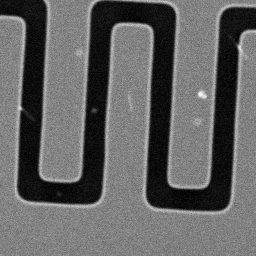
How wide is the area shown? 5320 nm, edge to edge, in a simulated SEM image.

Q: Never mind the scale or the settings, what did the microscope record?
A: groups of lines, slits or small figures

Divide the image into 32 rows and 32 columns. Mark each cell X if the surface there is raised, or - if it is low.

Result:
------XXXXXX---------XXXXXXXXXXX
------XXXXX-----------XXXXXX----
XXX---XXXXX-----------XXXXX-----
XXX---XXXXX---XXXXX---XXXXX-----
XXX---XXXXX---XXXXX---XXXXX---XX
XXX---XXXXX---XXXXX---XXXXX---XX
XXX---XXXXX---XXXXX---XXXXX---XX
XXX---XXXXX---XXXXX---XXXXX---XX
XXX---XXXXX---XXXXX---XXXXX---XX
XXX---XXXXX---XXXXX---XXXXX---XX
XXX---XXXXX---XXXXX---XXXXX---XX
XXX---XXXXX---XXXXX---XXXXX---XX
XXX--XXXXXX--XXXXXX---XXXXX---XX
XXX--XXXXXX--XXXXXX---XXXXX---XX
XX---XXXXXX--XXXXXX--XXXXXX--XXX
XX---XXXXXX--XXXXXX--XXXXXX--XXX
XX---XXXXX---XXXXXX--XXXXXX--XXX
XX---XXXXX---XXXXXX--XXXXX---XXX
XX---XXXXX---XXXXX---XXXXX---XXX
XX---XXXXX---XXXXX---XXXXX---XXX
XX---XXXXX---XXXXX---XXXXX---XXX
XX---XXXXX---XXXXX---XXXXX---XXX
XX----XXXX---XXXXX---XXXXX---XXX
XX-----------XXXXX----XXX----XXX
XX-----------XXXXX-----------XXX
XXXXXXXX----XXXXXXX----------XXX
XXXXXXXXXXXXXXXXXXXXXXXXX--XXXXX
XXXXXXXXXXXXXXXXXXXXXXXXXXXXXXXX
XXXXXXXXXXXXXXXXXXXXXXXXXXXXXXXX
XXXXXXXXXXXXXXXXXXXXXXXXXXXXXXXX
XXXXXXXXXXXXXXXXXXXXXXXXXXXXXXXX
XXXXXXXXXXXXXXXXXXXXXXXXXXXXXXXX